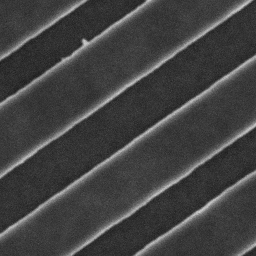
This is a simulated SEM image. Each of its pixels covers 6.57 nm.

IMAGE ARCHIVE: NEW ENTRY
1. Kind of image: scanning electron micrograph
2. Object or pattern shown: lines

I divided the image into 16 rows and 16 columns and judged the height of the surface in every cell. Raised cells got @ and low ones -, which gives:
@@@@@----@@@@@@-
@@@----@@@@@@@--
@@----@@@@@@----
----@@@@@@@-----
---@@@@@@-----@@
-@@@@@@@-----@@@
@@@@@@@-----@@@@
@@@@@-----@@@@@@
@@@@-----@@@@@@-
@@-----@@@@@@@--
@-----@@@@@@----
----@@@@@@@----@
---@@@@@@----@@@
--@@@@@@----@@@@
@@@@@@@---@@@@@@
@@@@@----@@@@@@@